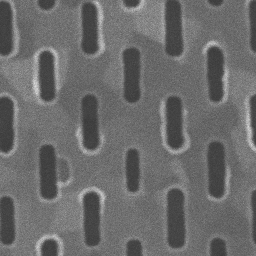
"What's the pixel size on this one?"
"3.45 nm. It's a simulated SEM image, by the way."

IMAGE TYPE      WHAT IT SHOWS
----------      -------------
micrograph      a regular array of holes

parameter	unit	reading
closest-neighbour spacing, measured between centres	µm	0.216